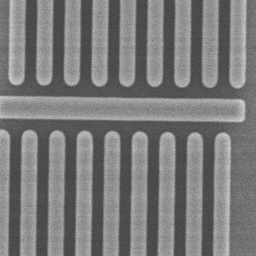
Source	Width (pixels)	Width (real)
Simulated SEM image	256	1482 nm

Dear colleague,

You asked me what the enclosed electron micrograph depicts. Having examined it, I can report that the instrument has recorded groups of lines, slits or small figures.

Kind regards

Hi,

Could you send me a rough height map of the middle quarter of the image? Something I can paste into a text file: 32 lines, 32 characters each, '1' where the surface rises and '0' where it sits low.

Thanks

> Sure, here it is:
11110001111000111100011110001110
11110001111000111100011100001110
11110001111000111100011100001110
11110001111000111100011100001110
11110001111000111000011100001110
00000000100000010000001100001110
00000000000000000000000000000000
00000000000000000000000000000000
11100000000000000000000000000000
11111111111111111111111111111111
11111111111111111111111111111111
11111111111111111111111111111111
11111111111111111111111111111111
11111111111111111111111111111111
00000000000000000000000000000000
00000000000000000000000000000000
00000000000000000000000000000000
00001110000110000011000001100000
00011110001111000111100011110001
00011110001111000111100011110001
00011110001111000111100011110001
00011110001111000111100011110001
00011110001111000111100011110001
00011110001111000111100011110001
00011110001111000111100011110001
00011110001111000111100011110001
00011110001111000111100011110001
00011110001111000111100011110001
00011110001111000111100011110001
00011110001111000111100011110001
00011110001111000111100011110001
00011110001111000111100011110001